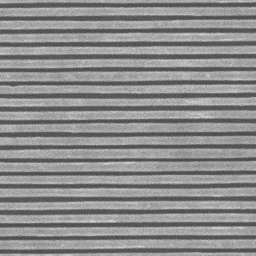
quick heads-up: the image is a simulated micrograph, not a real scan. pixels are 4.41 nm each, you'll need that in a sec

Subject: parallel lines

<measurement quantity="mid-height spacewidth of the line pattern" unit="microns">0.0187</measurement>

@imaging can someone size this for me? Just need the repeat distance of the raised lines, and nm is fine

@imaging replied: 57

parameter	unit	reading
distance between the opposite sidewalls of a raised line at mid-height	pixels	8.37